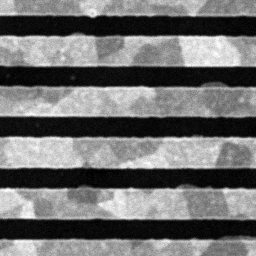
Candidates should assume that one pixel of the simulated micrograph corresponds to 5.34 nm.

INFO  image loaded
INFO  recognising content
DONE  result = lines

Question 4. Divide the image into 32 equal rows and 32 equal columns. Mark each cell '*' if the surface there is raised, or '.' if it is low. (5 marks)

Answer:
********************************
********************************
................................
................................
..............*.................
********************************
********************************
********************************
................................
................................
................................
********************************
********************************
********************************
................*****....**.***.
................................
................................
********************************
********************************
********************************
********************************
................................
................................
................................
********************************
********************************
********************************
................................
................................
................................
********************************
********************************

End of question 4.